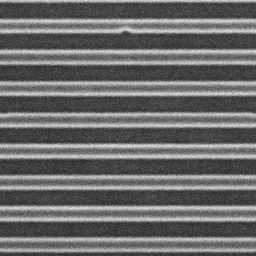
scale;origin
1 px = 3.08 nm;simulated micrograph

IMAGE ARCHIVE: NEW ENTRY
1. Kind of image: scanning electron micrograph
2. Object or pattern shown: parallel lines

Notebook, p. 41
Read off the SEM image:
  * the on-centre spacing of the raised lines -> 0.0962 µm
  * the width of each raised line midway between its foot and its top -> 38.9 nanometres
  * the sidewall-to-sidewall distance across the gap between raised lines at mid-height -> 55.4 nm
